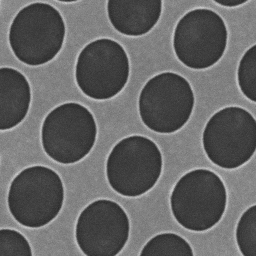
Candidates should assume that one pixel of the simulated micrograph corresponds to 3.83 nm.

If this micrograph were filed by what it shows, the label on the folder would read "a regular array of holes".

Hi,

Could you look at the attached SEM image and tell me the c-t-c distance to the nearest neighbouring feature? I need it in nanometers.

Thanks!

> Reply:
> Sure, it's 275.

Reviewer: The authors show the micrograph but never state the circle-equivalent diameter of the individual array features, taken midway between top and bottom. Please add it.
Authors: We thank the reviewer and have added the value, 223 nm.